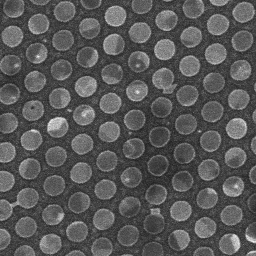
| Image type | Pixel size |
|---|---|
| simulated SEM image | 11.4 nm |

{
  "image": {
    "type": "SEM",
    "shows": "a regular array of raised bodies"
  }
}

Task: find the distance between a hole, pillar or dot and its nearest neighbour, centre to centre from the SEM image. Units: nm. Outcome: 328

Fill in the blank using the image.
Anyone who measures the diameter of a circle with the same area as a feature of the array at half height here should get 234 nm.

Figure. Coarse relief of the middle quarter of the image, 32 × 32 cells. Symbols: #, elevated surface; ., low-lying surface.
##..###....###..#####........###
##........####...###....##...###
##.......#####.........####...##
#...###...####........#####.....
...#####..###....###..#####.....
...#####........#####..#####..##
...#####........#####....##..###
#...###....##...#####.......####
#........#####..####....#...####
#......#.#####........#####..###
....##...#####........#####.....
...####...###.........#####.....
..######........####..####......
..#####........#####.........###
#..####........#####........####
#........#####..####........####
#........#####........####..####
.........#####.......#####....#.
...####..####........#####......
..#####.........###...####......
..#####........#####...##...####
..#####........#####........####
#........####..####.........####
........#####...##....###...####
........#####........#####...##.
...###..#####........#####......
..#####..###...####..#####......
..#####........####...###...###.
..####........#####........#####
...##....###...####........#####
........#####...##....##...#####
........#####........####...###.